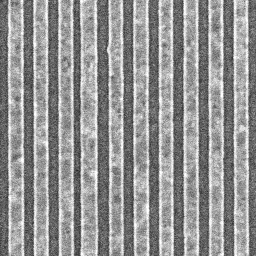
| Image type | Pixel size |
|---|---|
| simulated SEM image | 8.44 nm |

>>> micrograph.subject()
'parallel lines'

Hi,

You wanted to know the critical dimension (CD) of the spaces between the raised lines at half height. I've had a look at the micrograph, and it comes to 103 nm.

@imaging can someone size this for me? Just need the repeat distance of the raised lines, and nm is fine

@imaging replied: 211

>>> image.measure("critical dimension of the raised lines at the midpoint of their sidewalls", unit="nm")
111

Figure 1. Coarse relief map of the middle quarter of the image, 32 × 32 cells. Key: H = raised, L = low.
HHLLLHHHLLLLHHLLLLHHHLLLHHHLLLHH
HHLLLHHHLLLLHHLLLLHHHLLLHHHLLLHH
HHLLLHHHLLLLHHHLLLHHHLLLHHHLLLHH
HHLLLHHHLLLLHHHLLLHHHLLLHHHLLLHH
HHLLLHHHLLLLHHHLLLHHHLLLHHHLLLHH
HHLLLHHHLLLLHHHLLLHHHLLLHHHLLLHH
HHLLHHHHLLLLHHHLLLHHHLLLHHHLLLHH
HHLLHHHHLLLLHHHLLLHHHLLLHHHLLLHH
HHLLLHHHLLLLHHHLLLHHHLLLHHHLLLHH
HHLLLHHHLLLLHHLLLLHHHLLLHHHLLLHH
HHLLLHHHLLLLHHLLLLHHHLLLHHHLLLHH
HHLLLHHHLLLLHHLLLLHHHLLLHHHLLLHH
HHLLLHHHLLLLHHHLLLHHHLLLHHHLLLHH
HHLLLHHHLLLLHHHLLLHHHLLLHHHLLLHH
HHLLLHHHLLLLHHLLLLHHHLLLHHHLLLHH
HHLLLHHHLLLLHHLLLLHHHLLLHHHLLLHH
HHLLHHHHLLLLHHLLLLHHHLLLHHHLLLHH
HHLLHHHHLLLLHHHLLLHHHLLLHHHLLLHH
HHLLHHHHLLLLHHLLLLHHHLLLHHHLLLHH
HHLLHHHHLLLLHHLLLLHHHLLLHHHLLLHH
HHLLLHHHLLLLHHLLLLHHHLLLHHHLLLHH
HHLLLHHHLLLLHHLLLLHHHLLLHHHLLLHH
HHLLLHHHLLLLHHHLLLHHHLLLHHHLLLHH
HHLLHHHHLLLLHHHLLLHHHLLLHHHLLLHH
HHLLLHHHLLLLHHHLLLHHHLLLHHHLLLHH
HHLLLHHHLLLLHHLLLLHHHLLLHHHLLLHH
HHLLLHHHLLLLHHHLLLHHHLLLHHHLLLHH
HHLLLHHHLLLLHHHLLLHHHLLLHHHLLLHH
HHLLLHHHLLLLHHHLLLHHHLLLHHHLLLHH
HHLLLHHHLLLLHHLLLLHHHLLLHHHLLLHH
HHLLLHHHLLLLHHLLLLHHHLLLHHHLLLHH
HHLLLHHHLLLLHHLLLLHHHLLLHHHLLLHH